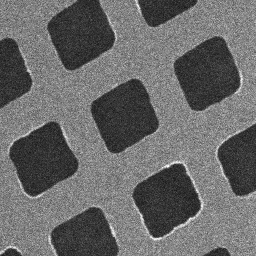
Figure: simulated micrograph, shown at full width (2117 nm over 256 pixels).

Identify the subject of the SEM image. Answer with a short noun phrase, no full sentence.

holes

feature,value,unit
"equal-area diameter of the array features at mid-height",544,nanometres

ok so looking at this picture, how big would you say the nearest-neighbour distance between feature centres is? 766 nanometres